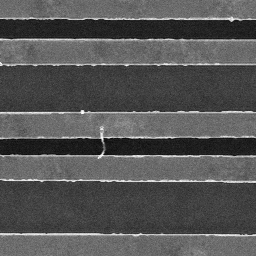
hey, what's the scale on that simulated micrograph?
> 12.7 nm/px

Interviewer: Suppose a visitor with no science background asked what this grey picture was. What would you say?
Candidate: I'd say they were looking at lines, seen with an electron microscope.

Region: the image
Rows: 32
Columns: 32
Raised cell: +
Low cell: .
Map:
++++++++++++++++++++++++++++++++
++++++++++++++++++++++++++++++++
............................++..
................................
................................
++++++++++++++++++++++++++++++++
++++++++++++++++++++++++++++++++
++++++++++++++++++++++++++++++++
................................
................................
................................
................................
................................
................................
++++++++++++++++++++++++++++++++
++++++++++++++++++++++++++++++++
++++++++++++++++++++++++++++++++
................................
................................
+++++++++++++++++++++++++++++..+
++++++++++++++++++++++++++++++++
++++++++++++++++++++++++++++++++
++++++++++++++++++++++++++++++++
................................
................................
................................
................................
................................
................................
++++++++++++++++++++++++++++++++
++++++++++++++++++++++++++++++++
++++++++++++++++++++++++++++++++